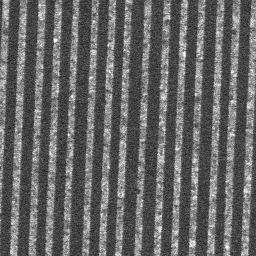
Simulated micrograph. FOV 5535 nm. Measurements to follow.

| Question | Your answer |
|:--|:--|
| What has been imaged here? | parallel lines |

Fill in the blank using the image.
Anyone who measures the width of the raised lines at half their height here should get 127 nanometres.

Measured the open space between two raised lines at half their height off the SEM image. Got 11.7 px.